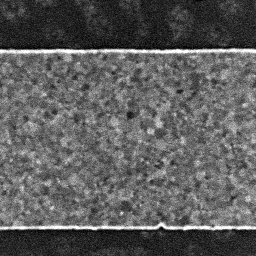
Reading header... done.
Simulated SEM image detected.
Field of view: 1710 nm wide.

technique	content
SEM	one or a few lines or trenches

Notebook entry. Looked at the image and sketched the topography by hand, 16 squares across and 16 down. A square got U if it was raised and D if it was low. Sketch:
DDDDDDDDDDDDDDDD
DDDDDDDDDDDDDDDD
DDDDDDDDDDDDDDDD
UUUUUUUUUUUUUUUU
UUUUUUUUUUUUUUUU
UUUUUUUUUUUUUUUU
UUUUUUUUUUUUUUUU
UUUUUUUUUUUUUUUU
UUUUUUUUUUUUUUUU
UUUUUUUUUUUUUUUU
UUUUUUUUUUUUUUUU
UUUUUUUUUUUUUUUU
UUUUUUUUUUUUUUUU
UUUUUUUUUUUUUUUU
DDDDDDDDDDDDDDDD
DDDDDDDDDDDDDDDD